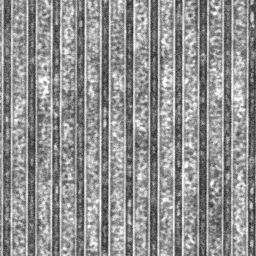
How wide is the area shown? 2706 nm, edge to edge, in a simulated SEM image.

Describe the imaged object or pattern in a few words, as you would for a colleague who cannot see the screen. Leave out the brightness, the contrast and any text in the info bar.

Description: parallel lines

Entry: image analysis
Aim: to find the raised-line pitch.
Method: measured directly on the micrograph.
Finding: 0.259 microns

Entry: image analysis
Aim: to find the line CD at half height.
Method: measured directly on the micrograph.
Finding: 163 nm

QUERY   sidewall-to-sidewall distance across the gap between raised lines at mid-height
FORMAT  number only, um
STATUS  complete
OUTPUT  0.0912